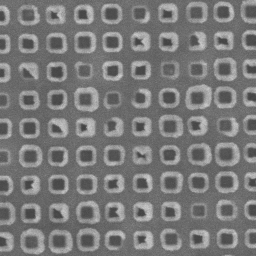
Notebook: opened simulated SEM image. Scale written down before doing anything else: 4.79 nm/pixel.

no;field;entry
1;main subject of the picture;a regular array of holes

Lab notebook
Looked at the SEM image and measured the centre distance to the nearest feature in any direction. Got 132 nm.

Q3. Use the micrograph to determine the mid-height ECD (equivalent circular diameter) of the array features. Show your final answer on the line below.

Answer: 63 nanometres